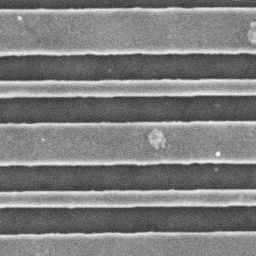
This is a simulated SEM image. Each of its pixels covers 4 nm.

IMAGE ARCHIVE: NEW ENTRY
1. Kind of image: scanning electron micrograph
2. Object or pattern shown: lines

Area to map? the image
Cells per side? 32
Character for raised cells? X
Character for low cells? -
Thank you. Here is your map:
--------------------------------
XXXXXXXXXXXXXXXXXXXXXXXXXXXXXXXX
XXXXXXXXXXXXXXXXXXXXXXXXXXXXXXXX
XXXXXXXXXXXXXXXXXXXXXXXXXXXXXXXX
XXXXXXXXXXXXXXXXXXXXXXXXXXXXXXXX
XXXXXXXXXXXXXXXXXXXXXXXXXXXXXXXX
XXXXXXXXXXXXXXXXXXXXXXXXXXXXXXXX
--------------------------------
--------------------------------
--------------------------------
XXXXXXXXXXXXXXXXXXXXXXXXXXXXXXXX
XXXXXXXXXXXXXXXXXXXXXXXXXXXXXXXX
--------------------------------
--------------------------------
--------------------------------
----XXXXXXXXXXXXXXXXXXXXXXXXXXXX
XXXXXXXXXXXXXXXXXXXXXXXXXXXXXXXX
XXXXXXXXXXXXXXXXXXXXXXXXXXXXXXXX
XXXXXXXXXXXXXXXXXXXXXXXXXXXXXXXX
XXXXXXXXXXXXXXXXXXXXXXXXXXXXXXXX
XXXXX-XXXXXXXX---X--------------
--------------------------------
--------------------------------
--------------------------------
XXXXXXXXXXXXXXXXXXXXXXXXXXXXXXXX
XXXXXXXXXXXXXXXXXXXXXXXXXXXXXXXX
--------------------------------
--------------------------------
--------------------------------
XXXXXXXXXXXXXXXXXXXXXXXXXXXXXXXX
XXXXXXXXXXXXXXXXXXXXXXXXXXXXXXXX
XXXXXXXXXXXXXXXXXXXXXXXXXXXXXXXX